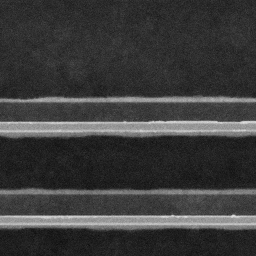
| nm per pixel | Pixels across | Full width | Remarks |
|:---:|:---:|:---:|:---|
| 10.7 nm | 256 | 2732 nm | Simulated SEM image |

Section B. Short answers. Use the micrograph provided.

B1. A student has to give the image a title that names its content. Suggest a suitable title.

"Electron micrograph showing lines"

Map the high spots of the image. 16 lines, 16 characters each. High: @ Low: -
----------------
----------------
----------------
----------------
----------------
----------------
@@@@@@@@@@@@@@@@
@@@@@@@@@@@@@@@@
----------------
----------------
----------------
----------------
@@@@@@@@@@@@@@@@
@@@@@@@@@@@@@@@@
----------------
----------------